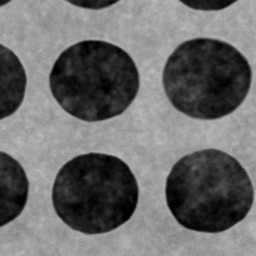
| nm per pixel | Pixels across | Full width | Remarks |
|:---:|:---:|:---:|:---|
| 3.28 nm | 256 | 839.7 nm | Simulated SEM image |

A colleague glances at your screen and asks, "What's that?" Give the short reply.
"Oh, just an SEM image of holes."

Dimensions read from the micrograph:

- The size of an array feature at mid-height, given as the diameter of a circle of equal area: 278 nanometres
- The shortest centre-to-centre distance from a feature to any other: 112 pixels